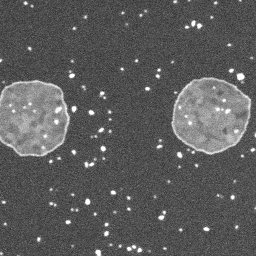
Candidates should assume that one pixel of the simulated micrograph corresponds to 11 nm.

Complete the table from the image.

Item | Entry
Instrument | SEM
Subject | raised bodies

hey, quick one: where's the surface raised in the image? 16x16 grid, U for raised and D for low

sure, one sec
DDDDDDDDDDDDDDDD
DDDDDDDDDDDDDDDD
DDDDDDDDDDDDDDDD
DDDDDDDDDDDDDDDD
DDDDDDDDDDDDDDDD
UUUUDDDDDDDDUUUD
UUUUDDDDDDDUUUUU
UUUUDDDDDDDUUUUU
UUUUDDDDDDDUUUUD
DUUDDDDDDDDDDUDD
DDDDDDDDDDDDDDDD
DDDDDDDDDDDDDDDD
DDDDDDDDDDDDDDDD
DDDDDDDDDDDDDDDD
DDDDDDDDDDDDDDDD
DDDDDDDDDDDDDDDD